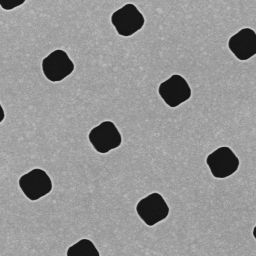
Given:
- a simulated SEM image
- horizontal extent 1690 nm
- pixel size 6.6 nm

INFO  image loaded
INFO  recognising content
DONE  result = holes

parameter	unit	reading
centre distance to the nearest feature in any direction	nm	553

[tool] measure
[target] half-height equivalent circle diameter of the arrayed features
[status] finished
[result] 200 nanometres